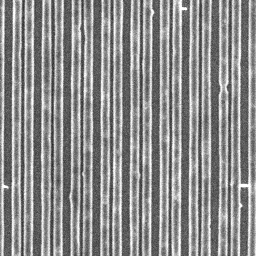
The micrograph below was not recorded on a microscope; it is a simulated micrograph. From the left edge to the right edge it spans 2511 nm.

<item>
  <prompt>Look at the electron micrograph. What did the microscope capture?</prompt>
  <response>parallel lines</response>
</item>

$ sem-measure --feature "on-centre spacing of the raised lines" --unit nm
143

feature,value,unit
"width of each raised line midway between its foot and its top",83.4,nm